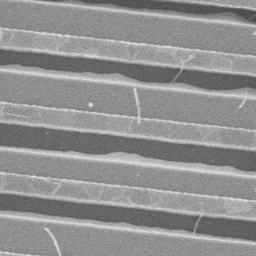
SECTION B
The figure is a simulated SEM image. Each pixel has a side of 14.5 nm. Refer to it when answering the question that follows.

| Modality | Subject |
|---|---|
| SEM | lines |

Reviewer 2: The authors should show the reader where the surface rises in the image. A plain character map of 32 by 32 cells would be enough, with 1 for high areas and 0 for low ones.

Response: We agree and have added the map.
11111111110000000000000000111111
11111111111111111110000000000000
11111111111111111111111111111000
11111111111111111111111111111111
11111111111111111111111111111111
11111111111111111111111111111111
00000011111111111111111111111111
00000000000000011111111111111111
00000000000000000000000111111111
11111111100000000000000000000000
11111111111111111100000000000000
11111111111111111111111111000010
11111111111111111111111111111111
11111111111111111111111111111111
11111111111111111111111111111111
00011111111111111111111111111111
00000000000001111111111111111111
00000000000000000000011111111111
10000000000000000000000000000011
11111111111000000000000000000000
11111111111111111111000000000000
11111111111111111111111111111000
11111111111111111111111111111111
11111111111111111111111111111111
00000111111111111111111111111111
00000000000000111111111111111111
00000000000000000000000111111111
11111111000000000000000000000000
11111111111111111000000000000000
11111111111111111111111110000000
11111111111111111111111111111111
11111111111111111111111111111111